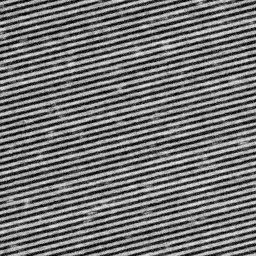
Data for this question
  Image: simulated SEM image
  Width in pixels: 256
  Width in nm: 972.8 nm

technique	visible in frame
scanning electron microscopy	parallel lines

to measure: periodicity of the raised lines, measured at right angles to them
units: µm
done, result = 0.0242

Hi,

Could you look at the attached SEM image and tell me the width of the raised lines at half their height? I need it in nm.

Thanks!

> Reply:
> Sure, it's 7.4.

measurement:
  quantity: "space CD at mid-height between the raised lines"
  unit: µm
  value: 0.0147